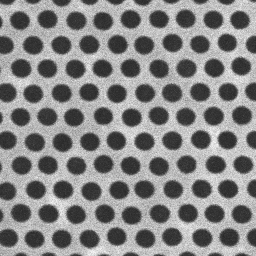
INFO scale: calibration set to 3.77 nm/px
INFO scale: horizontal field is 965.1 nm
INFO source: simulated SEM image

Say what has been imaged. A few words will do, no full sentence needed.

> a regular array of holes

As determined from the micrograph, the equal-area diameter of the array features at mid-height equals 19.4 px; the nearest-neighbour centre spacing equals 100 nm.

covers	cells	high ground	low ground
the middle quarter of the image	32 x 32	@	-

-----@@-----@@-----@@-----@@----
-----@@-----@@-----@@-----@@----
@----@@@----@@@----@@@----@@@---
@@--@@@@@@@@@@@@@@@@@@@--@@@@@-@
@@@@@@@@@@@@@@@@@@@@@@@@@@@@@@@@
-@@@----@@@@---@@@@---@@@---@@@@
--@@-----@@----@@@-----@@----@@@
--@@-----@@-----@@-----@------@@
--@@----@@@----@@@----@@@----@@@
-@@@@@@@@@@@---@@@@--@@@@@--@@@@
@@@@@@@@@@@@@@@@@@@@@@@@@@@@@@@@
@---@@@@----@@@---@@@@----@@@---
-----@@-----@@-----@@-----@@----
-----@@-----@@------@-----@@----
-----@@@----@@@----@@@----@@----
@---@@@@@@@@@@@@--@@@@@@@@@@@@-@
@@@@@@@@@@@@@@@@@@@@@@@@@@@@@@@@
@@@@@---@@@----@@@@---@@@----@@@
--@@-----@@----@@@----@@@----@@@
--@@-----@@-----@@-----@------@@
--@@-----@@----@@@----@@@----@@@
-@@@@---@@@@@-@@@@@--@@@@@@-@@@@
@@@@@@@@@@@@@@@@@@@@@@@@@@@@@@@@
@@--@@@@----@@@---@@@@@--@@@@---
@----@@-----@@-----@@-----@@----
@-----@-----@@-----@@-----@@----
@----@@@----@@-----@@-----@@@---
@@---@@@@@@@@@@@--@@@@---@@@@@-@
@@@@@@@@@@@@@@@@@@@@@@@@@@@@@@@@
-@@@@@@@@@@@@--@@@----@@@@---@@@
--@@@----@@-----@@-----@@-----@@
---@-----@@-----@------@@-----@@